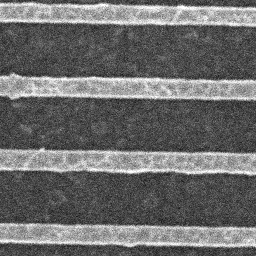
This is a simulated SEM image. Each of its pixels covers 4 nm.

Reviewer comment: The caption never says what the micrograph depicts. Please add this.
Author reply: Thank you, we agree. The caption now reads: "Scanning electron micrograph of one or a few lines or trenches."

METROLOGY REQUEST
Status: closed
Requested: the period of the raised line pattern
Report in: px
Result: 73.5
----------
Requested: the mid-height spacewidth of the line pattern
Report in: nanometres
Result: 221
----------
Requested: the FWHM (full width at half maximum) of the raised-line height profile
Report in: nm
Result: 72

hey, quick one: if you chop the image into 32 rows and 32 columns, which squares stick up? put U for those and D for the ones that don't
UUDDUDDDDDDDDDDDDDDDDDDDDDDDDDDD
UUUUUUUUUUUUUUUUUUUUUUUUUUUUUUUU
UUUUUUUUUUUUUUUUUUUUUUUUUUUUUUUU
DDDDDDDDDDDDDDDDDDDDDDDDDDDDDDDD
DDDDDDDDDDDDDDDDDDDDDDDDDDDDDDDD
DDDDDDDDDDDDDDDDDDDDDDDDDDDDDDDD
DDDDDDDDDDDDDDDDDDDDDDDDDDDDDDDD
DDDDDDDDDDDDDDDDDDDDDDDDDDDDDDDD
DDDDDDDDDDDDDDDDDDDDDDDDDDDDDDDD
DUDDDDDDDDDDDDDDDDDDDDDDDDDDDDDD
UUUUUUUUUUUUUUUUUUUUUUUUUUUUUUUU
UUUUUUUUUUUUUUUUUUUUUUUUUUUUUUUU
DDDDDDDDDDDDDDDDDDDDDDDDDDDDDDDD
DDDDDDDDDDDDDDDDDDDDDDDDDDDDDDDD
DDDDDDDDDDDDDDDDDDDDDDDDDDDDDDDD
DDDDDDDDDDDDDDDDDDDDDDDDDDDDDDDD
DDDDDDDDDDDDDDDDDDDDDDDDDDDDDDDD
DDDDDDDDDDDDDDDDDDDDDDDDDDDDDDDD
DDDDDDDDDDDDDDDDDDDDDDDDDDDDDDDD
UUUUUUUUUUUUUUUUUUUUUUUUUUUUUUUU
UUUUUUUUUUUUUUUUUUUUUUUUUUUUUUUU
DDDDDDDDDDDDDDDDUDDDDDDUUUUDUUUU
DDDDDDDDDDDDDDDDDDDDDDDDDDDDDDDD
DDDDDDDDDDDDDDDDDDDDDDDDDDDDDDDD
DDDDDDDDDDDDDDDDDDDDDDDDDDDDDDDD
DDDDDDDDDDDDDDDDDDDDDDDDDDDDDDDD
DDDDDDDDDDDDDDDDDDDDDDDDDDDDDDDD
DDDDDDDDDDDDDDDDDDDDDDDDDDDDDDDD
UUUUUUUUUUUUUUUUUUUUUUUUUUDDDDDD
UUUUUUUUUUUUUUUUUUUUUUUUUUUUUUUU
DDDDDDDDDDDDDDDUUUDDDDUUUUUUUUUU
DDDDDDDDDDDDDDDDDDDDDDDDDDDDDDDD